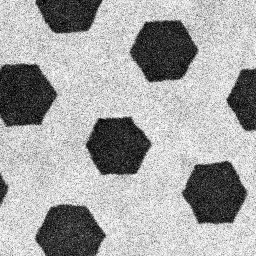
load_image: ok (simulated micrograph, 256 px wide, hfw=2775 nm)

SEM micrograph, holes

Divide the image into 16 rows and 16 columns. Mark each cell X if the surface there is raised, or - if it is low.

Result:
XX----XXXXXXXXXX
XXX---XXX--XXXXX
XXXXXXXX----XXXX
XXXXXXXX----XXXX
---XXXXXX---XXX-
---XXXXXXXXXXXX-
---XXXXXXXXXXX--
---XXX--XXXXXXX-
XXXXXX---XXXXXXX
XXXXXX---XXXXXXX
XXXXXX---XXX---X
XXXXXXXXXXXX---X
XXXXXXXXXXXX---X
XXX---XXXXXX---X
XX----XXXXXXXXXX
XXX---XXXXXXXXXX